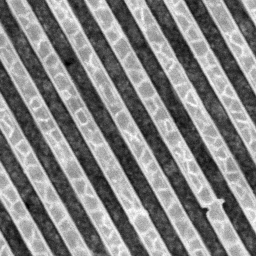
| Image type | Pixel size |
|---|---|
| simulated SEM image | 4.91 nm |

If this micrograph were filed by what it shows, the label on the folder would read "parallel lines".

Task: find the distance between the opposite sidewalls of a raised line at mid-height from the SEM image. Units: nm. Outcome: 74.8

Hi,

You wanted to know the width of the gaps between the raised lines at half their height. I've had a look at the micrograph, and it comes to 91.3 nanometres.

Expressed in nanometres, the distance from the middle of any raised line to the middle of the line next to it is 168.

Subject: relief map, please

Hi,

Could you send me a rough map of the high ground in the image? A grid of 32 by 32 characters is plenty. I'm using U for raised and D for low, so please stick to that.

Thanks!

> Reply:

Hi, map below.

DUUDDDUUDDDUUDDDUUDDDUUDDDUUDDDU
DDUUDDDUUDDDUUDDUUUDDUUUDDUUDDDU
DDUUUDDUUDDDUUDDDUUDDDUUDDDUUDDD
DDDUUDDDUUDDDUUDDDUUDDDUUDDUUUDD
UDDUUUDDUUUDDUUUDDUUDDDUUDDDUUDD
UDDDUUDDDUUDDDUUDDDUUDDDUUDDDUUD
UUDDDUUDDDUUDDUUUDDUUUDDUUDDDUUD
UUDDDUUDDDUUDDDUUDDDUUDDDUUDDDUU
DUUDDDUUDDDUUDDDUUDDUUUDDUUUDDUU
DUUUDDUUUDDUUDDDUUDDDUUDDDUUDDDU
DDUUDDDUUDDDUUDDDUUDDDUUDDDUUDDU
DDDUUDDUUUDDUUUDDUUDDDUUDDDUUDDD
DDDUUDDDUUDDDUUDDDUUDDDUUDDDUUDD
UDDDUUDDDUUDDUUUDDUUUDDUUDDDUUDD
UUDDUUDDDUUDDDUUDDDUUDDDUUDDDUUD
UUDDDUUDDDUUDDDUUDDUUUDDUUUDDUUU
UUUDDUUDDDUUDDDUUDDDUUDDDUUDDDUU
DUUDDDUUDDDUUDDDUUDDDUUDDDUUDDUU
DDUUDDUUUDDUUUDDUUDDDUUDDDUUDDDU
DDUUDDDUUDDDUUDDDUUDDDUUDDDUUDDD
DDDUUDDDUUDDUUUDDUUUDDUUDDDUUDDD
UDDUUDDDUUDDDUUDDDUUDDDUUDDDUUDD
UDDDUUDDDUUDDDUUDDDUUDDUUUDDUUUD
UUDDUUUDDUUDDDUUDDDUUDDDUUDDDUUD
UUDDDUUDDDUUDDDUUDDDUUDDDUUDDDUU
DUUDDDUUDDUUUDDUUUDDUUDDDUUUDDUU
DUUDDDUUDDDUUDDDUUDDDUUDDDUUDDDU
DDUUDDDUUDDDUUDDUUUDDUUUDDUUUDDU
DDUUUDDUUDDDUUDDDUUDDDUUDDDUUDDD
DDDUUDDDUUDDDUUDDDUUDDDUUDDUUUDD
UDDDUUDDUUUDDUUDDDUUDDDUUDDDUUDD
UDDDUUDDDUUDDDUUDDDUUDDDUUDDDUUD